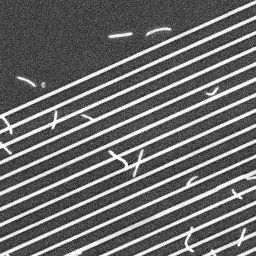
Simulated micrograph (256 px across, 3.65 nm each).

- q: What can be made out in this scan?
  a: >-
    parallel lines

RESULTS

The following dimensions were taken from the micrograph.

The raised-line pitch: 51.3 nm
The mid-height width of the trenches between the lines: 40.9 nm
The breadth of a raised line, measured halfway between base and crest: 10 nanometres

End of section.